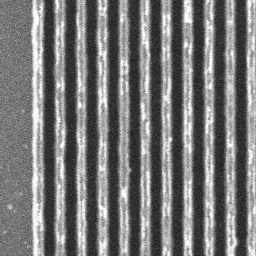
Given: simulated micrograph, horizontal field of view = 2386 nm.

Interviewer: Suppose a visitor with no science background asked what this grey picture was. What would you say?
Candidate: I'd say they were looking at parallel lines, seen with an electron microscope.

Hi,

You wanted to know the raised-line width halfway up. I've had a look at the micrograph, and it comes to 80.4 nanometers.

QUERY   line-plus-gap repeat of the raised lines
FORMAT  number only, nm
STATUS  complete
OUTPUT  198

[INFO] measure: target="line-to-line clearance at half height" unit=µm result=0.118